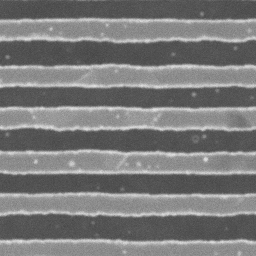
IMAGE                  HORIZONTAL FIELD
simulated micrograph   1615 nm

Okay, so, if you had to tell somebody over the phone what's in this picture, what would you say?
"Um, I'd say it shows lines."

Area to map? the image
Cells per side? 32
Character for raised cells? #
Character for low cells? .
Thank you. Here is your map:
................................
................................
...#.#################.........#
################################
################################
................................
................................
................................
################################
################################
################################
................................
................................
.#.....###.#####...............#
################################
################################
................................
................................
................................
################################
################################
################################
................................
................................
################################
################################
################################
................................
................................
................................
################################
################################